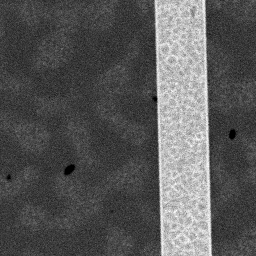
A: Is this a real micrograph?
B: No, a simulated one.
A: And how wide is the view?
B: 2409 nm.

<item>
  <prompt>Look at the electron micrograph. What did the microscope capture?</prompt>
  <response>one or a few lines or trenches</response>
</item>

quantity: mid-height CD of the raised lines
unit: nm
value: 458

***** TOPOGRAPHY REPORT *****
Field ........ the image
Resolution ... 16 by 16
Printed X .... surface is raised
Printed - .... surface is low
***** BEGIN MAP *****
----------XXX---
----------XXX---
----------XXX---
----------XXX---
----------XXX---
----------XXX---
----------XXX---
----------XXX---
----------XXX---
----------XXX---
----------XXX---
----------XXX---
----------XXX---
----------XXX---
----------XXX---
----------XXX---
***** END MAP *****